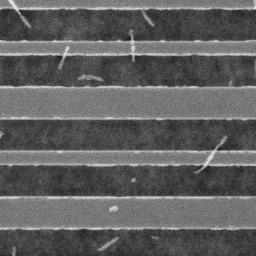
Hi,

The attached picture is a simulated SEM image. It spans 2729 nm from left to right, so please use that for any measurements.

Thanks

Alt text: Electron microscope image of lines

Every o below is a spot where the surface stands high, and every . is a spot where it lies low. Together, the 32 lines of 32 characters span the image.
oooooooooooooooooooooooooooooooo
................................
................................
................................
................................
oooooooooooooooooooooooooooooooo
oooooooooooooooooooooooooooooooo
................................
................................
................................
................................
oooooooooooooooooooooooooooooooo
oooooooooooooooooooooooooooooooo
oooooooooooooooooooooooooooooooo
oooooooooooooooooooooooooooooooo
................................
................................
................................
................................
oooooooooooooooooooooooooooooooo
oooooooooooooooooooooooooooooooo
................................
................................
................................
................................
oooooooooooooooooooooooooooooooo
oooooooooooooooooooooooooooooooo
oooooooooooooooooooooooooooooooo
oooooooooooooooooooooooooooooooo
................................
................................
................................